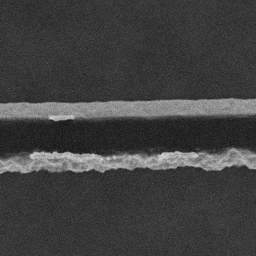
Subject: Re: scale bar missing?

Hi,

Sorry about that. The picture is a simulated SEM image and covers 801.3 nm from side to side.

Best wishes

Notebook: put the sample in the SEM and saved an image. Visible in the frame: one or a few lines or trenches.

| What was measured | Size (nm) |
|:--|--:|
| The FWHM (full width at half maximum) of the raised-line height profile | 171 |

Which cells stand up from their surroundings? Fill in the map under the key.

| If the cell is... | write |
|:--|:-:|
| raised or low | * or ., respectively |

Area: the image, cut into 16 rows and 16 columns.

................
................
................
................
................
................
................
****************
****************
****************
................
................
................
................
................
................